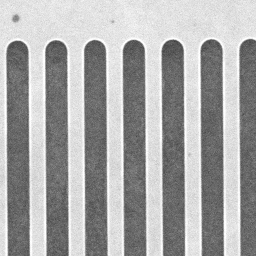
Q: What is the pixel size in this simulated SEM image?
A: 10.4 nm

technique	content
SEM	groups of lines, slits or small figures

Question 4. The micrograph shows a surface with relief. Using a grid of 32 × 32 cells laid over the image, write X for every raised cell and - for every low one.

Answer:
XXXXXXXXXXXXXXXXXXXXXXXXXXXXXXXX
XXXXXXXXXXXXXXXXXXXXXXXXXXXXXXXX
XXXXXXXXXXXXXXXXXXXXXXXXXXXXXXXX
XXXXXXXXXXXXXXXXXXXXXXXXXXXXXXXX
XXXXXXXXXXXXXXXXXXXXXXXXXXXXXXXX
X--XXX--XXX--XXX--XX---XX---XX--
X---XX--XX---XX---XX---XX---XX--
X---XX---X---XX---XX---XX---XX--
X---XX---X---XX---XX---XX---XX--
X---XX---X---XX---XX---XX---XX--
X---XX---X---XX---XX---XX---XX--
X---XX---X---XX---XX---XX---XX--
X---XX---X---XX---XX---XX---XX--
X---XX---X---XX---XX---XX---XX--
X---XX---X---XX---XX---XX---XX--
X---XX---X---XX---XX---XX---XX--
X---XX---X---XX---XX---XX---XX--
X---XX---XX--XX---XX---XX---XX--
X---XX---XX--XX---XX---XX---XX--
X---XX---XX--XX---XX---XX---XX--
X---XX---XX--XX---XX---XX---XX--
X---XX---XX--XX---XX---XX---XX--
X---XX---XX--XX---XX---XX---XX--
X---XX---XX--XX---XX---XX---XX--
X---XX---XX--XX---XX---XX---XX--
X---XX---XX--XX---XX---XX---XX--
X---XX---XX--XX---XX---XX---XX--
X---XX---XX--XX---XX---XX---XX--
X---XX---XX--XX---XX---XX---XX--
X---XX---XX--XX---XX---XX---XX--
X---XX---XX---X---XX---XX---XX--
X---XX---XX---X---XX---XX---XX--